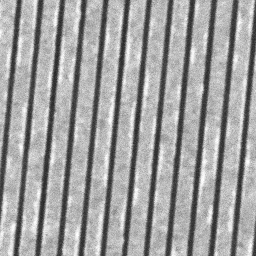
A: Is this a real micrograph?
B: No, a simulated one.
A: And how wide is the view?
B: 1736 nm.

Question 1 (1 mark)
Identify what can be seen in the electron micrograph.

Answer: parallel lines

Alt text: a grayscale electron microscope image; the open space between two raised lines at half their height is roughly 44.7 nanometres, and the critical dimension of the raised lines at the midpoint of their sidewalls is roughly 102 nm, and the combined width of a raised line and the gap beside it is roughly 21.6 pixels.